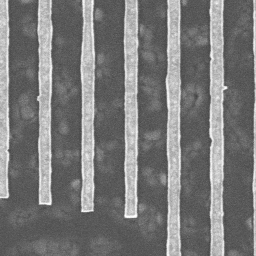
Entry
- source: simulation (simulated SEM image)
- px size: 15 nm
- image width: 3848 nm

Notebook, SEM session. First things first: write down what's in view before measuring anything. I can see parallel lines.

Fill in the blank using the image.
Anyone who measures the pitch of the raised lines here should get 648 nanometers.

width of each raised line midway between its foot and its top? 167 nanometres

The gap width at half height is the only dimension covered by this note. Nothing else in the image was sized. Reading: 473 nm